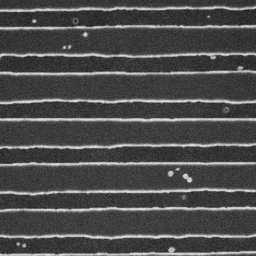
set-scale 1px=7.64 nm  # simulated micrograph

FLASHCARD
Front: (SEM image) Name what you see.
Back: lines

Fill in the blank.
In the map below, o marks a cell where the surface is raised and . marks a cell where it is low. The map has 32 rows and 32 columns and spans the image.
oooooooooooooooooooooooooooooooo
................................
................................
o.oooooooooooooooooooooooooooooo
oooooooooooooooooooooooooooooooo
oooooooooooooooooooooooooooooooo
oooooooooooooooooooooooooooooooo
................................
................................
oooooooooooooooooooooooooooooooo
oooooooooooooooooooooooooooooooo
oooooooooooooooooooooooooooooooo
oooooooooooooooooooooooooooooooo
................................
................................
oooooooooooooooooooooooooooooooo
oooooooooooooooooooooooooooooooo
oooooooooooooooooooooooooooooooo
.........oo.....................
................................
..oooooooooooooooooooooooooooooo
oooooooooooooooooooooooooooooooo
oooooooooooooooooooooooooooooooo
oooooooooooooooooooooooooooooooo
................................
................................
oooooooooooooooooooooooooooooooo
oooooooooooooooooooooooooooooooo
oooooooooooooooooooooooooooooooo
oooooooooooooooooooooooooooooooo
................................
................................